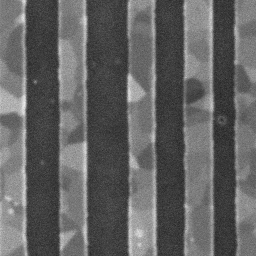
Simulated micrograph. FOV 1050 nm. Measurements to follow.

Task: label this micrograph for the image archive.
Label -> lines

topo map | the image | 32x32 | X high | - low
XXX----XXXX-----XXX----XXX---XXX
XXX----XXXX-----XXX----XXX---XXX
XXX----XXXX-----XXX----XXX---XXX
XXX----XXXX-----XXX----XXX---XXX
XXX----XXXX-----XXX----XXX---XXX
XXX----XXXX-----XXX----XXX---XXX
XXX----XXXX-----XXX----XXX---XXX
XXX-----XXX-----XXX----XXX---XXX
XXX----XXXX-----XXX----XXX---XXX
XXX----XXXX-----XXX----XXX---XXX
XXX-----XXX-----XXX----XXX---XXX
XXX-----XXX-----XXX----XXX---XXX
XXX-----XXX-----XXX----XXX---XXX
XXX-----XXX-----XXX----XXX---XXX
XXX-----XXX-----XXX----XXX----XX
XXX-----XXX-----XXX----XXX---XXX
XXX-----XXX-----XXX----XXX---XXX
XXX-----XXX-----XXX----XXX---XXX
XXX-----XXX-----XXX----XXX---XXX
XXX-----XXX-----XXX----XXX---XXX
XXX-----XXX-----XXX----XXXX--XXX
XXX-----XXX-----XXX----XXX----XX
XXX-----XXX-----XXX----XXX----XX
XXX-----XXX-----XXX----XXX----XX
XXX-----XXX-----XXX----XXX---XXX
XXX-----XXX-----XXX----XXX---XXX
XXX-----XXX-----XXX----XXX----XX
XXX-----XXX-----XXX----XXXX---XX
XXX-----XXX-----XXX----XXX----XX
XXX-----XXX-----XXX----XXXX---XX
XXX-----XXX-----XXX----XXXX---XX
XXX-----XXX-----XXX----XXXX---XX